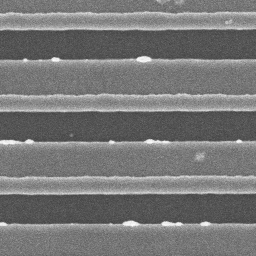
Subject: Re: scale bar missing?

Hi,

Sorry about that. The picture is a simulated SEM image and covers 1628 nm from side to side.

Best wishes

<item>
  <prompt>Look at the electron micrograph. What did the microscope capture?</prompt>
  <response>lines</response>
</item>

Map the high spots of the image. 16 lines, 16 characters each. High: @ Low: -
@@@@@@@@@@@@@@@@
@@@@@@@@@@@@@@@@
----------------
----------------
@@@@@@@@@@@@@@@@
@@@@@@@@@@@@@@@@
@@@@@@@@@@@@@@@@
----------------
----------------
@@@@@@@@@@@@@@@@
@@@@@@@@@@@@@@@@
@@@@@@@@@@@@@@@@
----------------
----------------
@@@@@@@@@@@@@@@@
@@@@@@@@@@@@@@@@